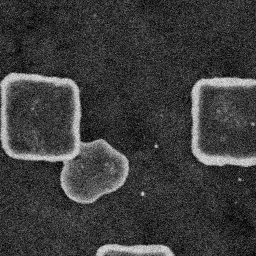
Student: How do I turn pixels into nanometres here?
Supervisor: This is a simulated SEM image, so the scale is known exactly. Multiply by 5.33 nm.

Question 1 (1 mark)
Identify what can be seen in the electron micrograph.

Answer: raised bodies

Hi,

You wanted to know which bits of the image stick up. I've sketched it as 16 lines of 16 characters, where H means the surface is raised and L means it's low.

LLLLLLLLLLLLLLLL
LLLLLLLLLLLLLLLL
LLLLLLLLLLLLLLLL
LLLLLLLLLLLLLLLL
LLLLLLLLLLLLLLLL
HHHHHLLLLLLLHHHH
HHHHHLLLLLLLHHHH
HHHHHLLLLLLLHHHH
HHHHHLLLLLLLHHHH
LHHHHLLLLLLLHHHH
LLLLLLLLLLLLLLLL
LLLLLLLLLLLLLLLL
LLLLLLLLLLLLLLLL
LLLLLLLLLLLLLLLL
LLLLLLLLLLLLLLLL
LLLLLLLLLLLLLLLL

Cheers